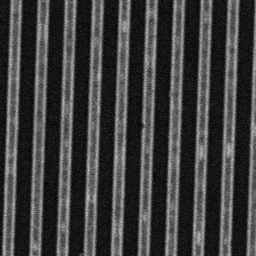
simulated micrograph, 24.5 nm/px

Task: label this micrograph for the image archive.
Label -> parallel lines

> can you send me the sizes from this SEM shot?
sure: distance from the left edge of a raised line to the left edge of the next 664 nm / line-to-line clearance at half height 419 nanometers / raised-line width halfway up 232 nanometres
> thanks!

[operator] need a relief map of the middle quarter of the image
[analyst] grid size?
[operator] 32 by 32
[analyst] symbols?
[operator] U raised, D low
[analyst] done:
UUDDDDDUUDDDDDUUDDDDUUUDDDDUUDDD
UUDDDDDUUDDDDUUUDDDDUUDDDDDUUDDD
UUDDDDDUUDDDDUUUDDDDUUDDDDDUUDDD
UUDDDDDUUDDDDUUUDDDDUUDDDDDUUDDD
UUDDDDDUUDDDDUUUDDDDUUDDDDDUUDDD
UUDDDDDUUDDDDUUDDDDDUUDDDDDUUDDD
UUDDDDDUUDDDDUUDDDDDUUDDDDDUUDDD
UUDDDDDUUDDDDUUDDDDDUUDDDDDUUDDD
UUDDDDDUUDDDDUUDDDDDUUDDDDDUUDDD
UUDDDDDUUDDDDUUUDDDDUUDDDDDUUDDD
UUDDDDDUUDDDDUUUDDDDUUDDDDDUUDDD
UUDDDDDUUDDDDUUDDDDDUUDDDDDUUDDD
UUDDDDUUUDDDDUUDDDDDUUDDDDDUUDDD
UUDDDDUUUDDDDUUDDDDDUUDDDDDUUDDD
UUDDDDUUUDDDDUUDDDDDUUDDDDDUUDDD
UUDDDDUUUDDDDUUDDDDDUUDDDDDUUDDD
UUDDDDUUDDDDDUUDDDDDUUDDDDDUUDDD
UUDDDDUUDDDDDUUDDDDDUUDDDDDUUDDD
UUDDDDUUDDDDDUUDDDDDUUDDDDDUUDDD
UUDDDDUUDDDDDUUDDDDDUUDDDDDUUDDD
UDDDDDUUDDDDDUUDDDDDUUDDDDDUUDDD
UDDDDDUUDDDDDUUDDDDDUUDDDDDUUDDD
UDDDDDUUDDDDDUUDDDDDUUDDDDUUUDDD
UDDDDDUUDDDDDUUDDDDDUUDDDDUUUDDD
UDDDDDUUDDDDDUUDDDDDUUDDDDUUUDDD
UDDDDDUUDDDDDUUDDDDDUUDDDDUUUDDD
UDDDDDUUDDDDDUUDDDDDUUDDDDUUDDDD
UDDDDDUUDDDDDUUDDDDUUUDDDDUUDDDD
UDDDDDUUDDDDDUUDDDDUUUDDDDUUDDDD
UDDDDDUUDDDDDUUDDDDUUUDDDDUUDDDD
UDDDDDUUDDDDDUUDDDDUUUDDDDUUDDDD
UDDDDDUUDDDDUUUDDDDUUDDDDDUUDDDD